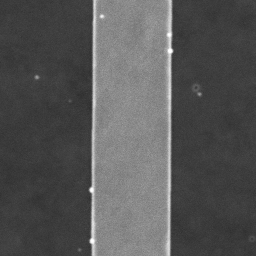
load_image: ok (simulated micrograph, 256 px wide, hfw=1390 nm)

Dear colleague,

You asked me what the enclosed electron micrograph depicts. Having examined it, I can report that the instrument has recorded wiring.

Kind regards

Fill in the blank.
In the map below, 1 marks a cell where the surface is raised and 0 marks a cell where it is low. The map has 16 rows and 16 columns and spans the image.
0000001111100000
0000001111100000
0000001111100000
0000001111100000
0000001111100000
0000001111100000
0000001111100000
0000001111100000
0000001111100000
0000001111100000
0000001111100000
0000001111100000
0000001111100000
0000001111100000
0000001111100000
0000001111100000